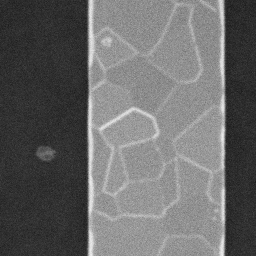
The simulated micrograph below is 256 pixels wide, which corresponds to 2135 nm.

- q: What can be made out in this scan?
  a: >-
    wiring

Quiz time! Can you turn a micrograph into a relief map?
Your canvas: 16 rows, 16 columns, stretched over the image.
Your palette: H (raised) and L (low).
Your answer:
LLLLLLHHHHHHHHLL
LLLLLLHHHHHHHHLL
LLLLLLHHHHHHHHLL
LLLLLLHHHHHHHHLL
LLLLLLHHHHHHHHLL
LLLLLLHHHHHHHHLL
LLLLLLHHHHHHHHLL
LLLLLLHHHHHHHHLL
LLLLLLHHHHHHHHLL
LLLLLLHHHHHHHHLL
LLLLLLHHHHHHHHLL
LLLLLLHHHHHHHHLL
LLLLLLHHHHHHHHLL
LLLLLLHHHHHHHHLL
LLLLLLHHHHHHHHLL
LLLLLLHHHHHHHHLL